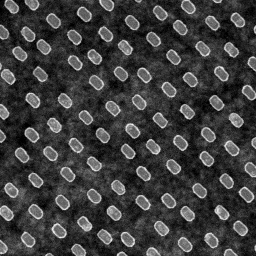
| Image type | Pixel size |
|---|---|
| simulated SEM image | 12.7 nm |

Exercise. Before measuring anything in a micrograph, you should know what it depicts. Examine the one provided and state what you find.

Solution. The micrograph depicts a regular array of raised bodies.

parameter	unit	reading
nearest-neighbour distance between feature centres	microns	0.326